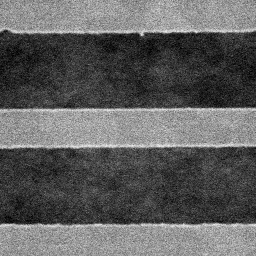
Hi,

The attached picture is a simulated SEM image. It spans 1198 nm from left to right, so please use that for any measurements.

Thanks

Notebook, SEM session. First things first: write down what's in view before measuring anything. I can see one or a few lines or trenches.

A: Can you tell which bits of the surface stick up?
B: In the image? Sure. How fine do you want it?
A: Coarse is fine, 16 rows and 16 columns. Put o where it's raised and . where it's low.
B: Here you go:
oooooooooooooooo
oooooooooooooooo
................
................
................
................
................
oooooooooooooooo
oooooooooooooooo
................
................
................
................
................
oooooooooooooooo
oooooooooooooooo